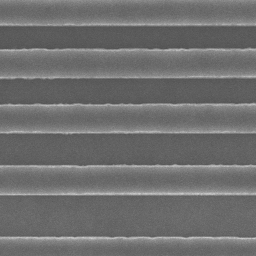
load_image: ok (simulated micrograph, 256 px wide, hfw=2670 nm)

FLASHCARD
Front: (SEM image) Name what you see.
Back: lines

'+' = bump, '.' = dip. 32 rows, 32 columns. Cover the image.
++++++++++++++++++++++++++++++++
++++++++++++++++++++++++++++++++
++++++++++++++++++++++++++++++++
................................
................................
................................
++++++++++++++++++++++++++++++++
++++++++++++++++++++++++++++++++
++++++++++++++++++++++++++++++++
++++++++++++++++++++++++++++++++
................................
................................
................................
++++++++++++++++++++++++++++++++
++++++++++++++++++++++++++++++++
++++++++++++++++++++++++++++++++
++.+++++++++++.++.+.++++++....++
................................
................................
................................
................................
++++++++++++++++++++++++++++++++
++++++++++++++++++++++++++++++++
++++++++++++++++++++++++++++++++
................................
................................
................................
................................
................................
................................
++++++++++++++++++++++++++++++++
++++++++++++++++++++++++++++++++